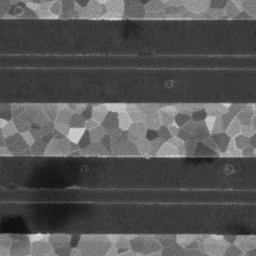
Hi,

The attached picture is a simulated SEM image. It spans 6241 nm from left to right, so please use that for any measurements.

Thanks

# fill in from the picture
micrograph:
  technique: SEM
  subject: lines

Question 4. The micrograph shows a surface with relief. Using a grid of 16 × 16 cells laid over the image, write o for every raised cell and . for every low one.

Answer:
oooooooooooooooo
................
................
................
................
................
................
oooooooooooooooo
oooooooooooooooo
oooooooooooooooo
................
................
................
................
................
oooooooooooooooo